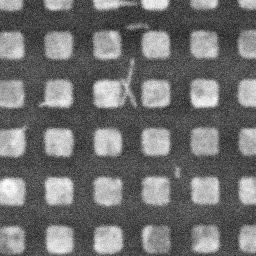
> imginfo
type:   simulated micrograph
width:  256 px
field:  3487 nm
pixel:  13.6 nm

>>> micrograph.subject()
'a regular array of raised bodies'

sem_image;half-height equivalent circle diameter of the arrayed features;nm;378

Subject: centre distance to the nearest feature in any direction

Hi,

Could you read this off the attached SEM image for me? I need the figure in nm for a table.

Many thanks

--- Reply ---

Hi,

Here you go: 656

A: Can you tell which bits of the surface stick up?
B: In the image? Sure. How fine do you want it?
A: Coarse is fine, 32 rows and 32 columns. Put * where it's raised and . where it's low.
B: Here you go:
***...***...***...***...***...**
................................
................................
................................
***...***...***...***...***...**
***...***...***...***...***...**
***...***...***...***...***...**
................................
................................
................................
***...**....***...***...***...**
***...***...***...***...***...**
***...***...***...***...***...**
................................
................................
................................
***...***...***...***...***...**
***...***...***...***...***...**
***...***...***...***...***...**
................................
................................
................................
.*....**....***....**...***...**
***...***...***...***...***...**
***...***...***...***...***...**
......**.....*..................
................................
................................
.*....**.....**...***....**...**
***...***...***...***...***...**
***...***...***...***...***...**
**.....*.....**....*............